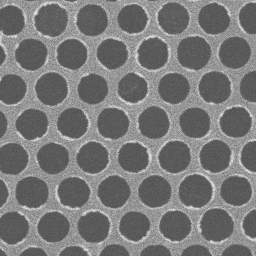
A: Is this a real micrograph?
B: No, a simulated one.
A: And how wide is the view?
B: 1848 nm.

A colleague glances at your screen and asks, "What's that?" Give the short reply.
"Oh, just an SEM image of a regular array of holes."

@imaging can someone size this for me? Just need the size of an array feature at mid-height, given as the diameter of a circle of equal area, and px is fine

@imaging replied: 32.1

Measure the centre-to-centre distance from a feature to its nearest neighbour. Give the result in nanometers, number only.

287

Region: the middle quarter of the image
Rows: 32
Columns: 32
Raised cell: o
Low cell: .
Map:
.....ooooo....ooooo......ooooo..
oo.ooooooooooooooooooooooooooooo
ooooooo.oooooooo..oooooooo...ooo
oooo......oooo......oooo.......o
.ooo.......ooo.......ooo.......o
.oo........oo........oo.........
.oo........oo........oo.........
.oo........oo........ooo.......o
oooo......oooo......oooo.......o
ooooo....ooooooo..oooooooo...ooo
oooooooooooooooooooooo.ooooooooo
....oooooo....oooooo.....ooooo..
.....oooo......oooo.......ooo...
......oo........ooo.......ooo...
......oo........ooo.......ooo...
......oo........ooo.......ooo...
......ooo.......ooo.......ooo...
.....oooo......oooo.......oooo..
o...ooooooo...ooooooo...oooooooo
oooooo..oooooooooooooooooo....oo
ooooo.....ooooo.....ooooo......o
.ooo.......ooo.......ooo.......o
.oo........oo........ooo........
..o........oo........oo.........
.oo........ooo.......ooo.......o
.ooo.......ooo.......ooo.......o
ooooo.....ooooo.....ooooo.....oo
ooooooo.ooooooooooooooooooo.oooo
o...oooooo.....oooooo....ooooo..
......ooo.......ooo.......ooo...
......ooo.......ooo........oo...
.......o.........o.........o....